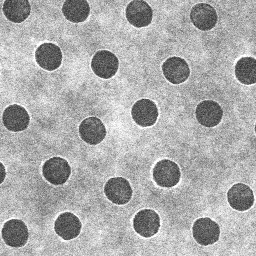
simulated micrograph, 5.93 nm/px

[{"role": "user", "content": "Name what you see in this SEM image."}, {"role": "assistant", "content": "a regular array of holes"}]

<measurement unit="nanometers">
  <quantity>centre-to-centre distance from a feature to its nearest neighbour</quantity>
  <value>316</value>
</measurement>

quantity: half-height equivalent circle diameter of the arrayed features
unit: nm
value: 169